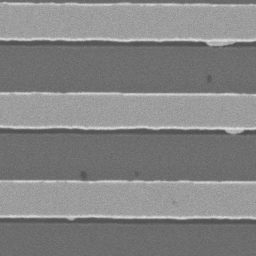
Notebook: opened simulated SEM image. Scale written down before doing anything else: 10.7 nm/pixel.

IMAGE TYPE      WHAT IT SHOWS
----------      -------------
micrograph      lines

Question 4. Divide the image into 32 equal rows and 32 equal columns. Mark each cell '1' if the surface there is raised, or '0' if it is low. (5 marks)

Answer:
11111010110000011000000000000000
11111111111111111111111111111111
11111111111111111111111111111111
11111111111111111111111111111111
11111111111111111111111111111111
00000000000000000000000000000000
00000000000000000000000000000000
00000000000000000000000000000000
00000000000000000000000000000000
00000000000000000000000000000000
00000000000000000000000000000000
00000000000000000000000000000000
11111111111111111111111111111111
11111111111111111111111111111111
11111111111111111111111111111111
11111111111111111111111111111111
00000000000000000000000000000000
00000000000000000000000000000000
00000000000000000000000000000000
00000000000000000000000000000000
00000000000000000000000000000000
00000000000000000000000000000000
00000000000000000000000000000000
11111111111111111111111111111111
11111111111111111111111111111111
11111111111111111111111111111111
11111111111111111111111111111111
00000000000000000000000000000000
00000000000000000000000000000000
00000000000000000000000000000000
00000000000000000000000000000000
00000000000000000000000000000000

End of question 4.